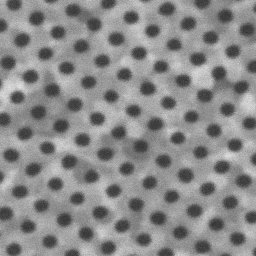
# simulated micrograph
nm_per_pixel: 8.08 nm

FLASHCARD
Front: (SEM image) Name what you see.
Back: a regular array of holes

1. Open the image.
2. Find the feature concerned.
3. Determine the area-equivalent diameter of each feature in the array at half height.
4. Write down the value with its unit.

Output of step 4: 0.127 micrometres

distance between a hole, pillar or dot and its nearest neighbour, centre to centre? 206 nanometers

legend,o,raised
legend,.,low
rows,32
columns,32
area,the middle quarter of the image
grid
...ooooo...ooooooooooo....oooooo
...ooooooooooo...ooooo....oooooo
..ooooooooooo....oooooooooooo..o
oooo....ooooo....ooooooooooo....
oooo....ooooooo.oooo..oooooo....
oooo....ooooooooooo....ooooo...o
ooooooooooo..oooooo....ooooooooo
oooooooooo....ooooo...oooooooooo
oo..oooooo....ooooooooooo..ooooo
o....oooooo..ooooooooooo....oooo
o....ooooooooooo...ooooo....oooo
o...ooooooooooo....ooooooo.oooo.
ooooooo...ooooo....ooooooooooo..
oooooo....oooooooooooo..oooooo..
.ooooo....ooooooooooo....ooooo..
.oooooo..oooo.ooooooo....ooooooo
.ooooooooooo....ooooo...oooooooo
ooo...oooooo....ooooooooooo...oo
ooo....ooooo...ooooooooooo....oo
ooo....ooooooooooo...ooooo....oo
oooo..ooooooooooo....ooooooo.ooo
oooooooo....ooooo....ooooooooooo
o.oooooo.....ooooooooooo..oooooo
...ooooo....ooooooooooo....ooooo
...oooooooooooo..oooooo....ooooo
...ooooooooooo....ooooo...oooooo
.ooooo..oooooo....ooooooooooo...
ooooo....ooooo...ooooooooooo....
ooooo....ooooooooooo...ooooo....
ooooo...ooooooooooo.....ooooo...
ooooooooooo...ooooo....ooooooooo
oooooooooo.....ooooo..oooo..oooo